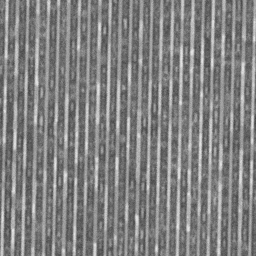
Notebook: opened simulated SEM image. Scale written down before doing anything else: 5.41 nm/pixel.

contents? parallel lines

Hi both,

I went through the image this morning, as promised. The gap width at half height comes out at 7.25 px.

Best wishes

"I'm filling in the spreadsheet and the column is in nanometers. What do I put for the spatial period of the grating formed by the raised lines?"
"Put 55.8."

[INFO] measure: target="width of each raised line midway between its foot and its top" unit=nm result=14.9